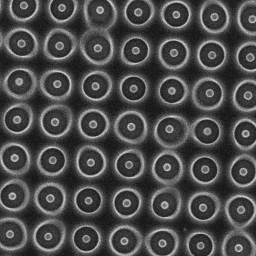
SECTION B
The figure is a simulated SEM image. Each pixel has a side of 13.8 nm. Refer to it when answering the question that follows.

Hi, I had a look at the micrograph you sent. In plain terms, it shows an array of small figures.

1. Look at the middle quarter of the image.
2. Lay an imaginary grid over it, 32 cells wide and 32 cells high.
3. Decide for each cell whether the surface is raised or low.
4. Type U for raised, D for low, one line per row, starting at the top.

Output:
UUUUUUUUUUUUUUUUUUUUUUUUUUDDDUUU
UUUUUUUUUUUUUUUUUUUUUUUUUUUUUUUU
UUUUUUUDDUUUUUUUUUUUUUUUUUUUUUUU
DUUUUUDDDDDUUUUUDDDUUUUUUUUDUUUU
DDUUUDDDDDDUUUUDDDDDUUUUUDDDDUUU
DDUUUDDDDDDDUUDDDDDDUUUUDDDDDDUU
DUUUUDDDDDDUUUDDDDDDDUUUDDDDDDUU
DUUUUDDDDDDUUUUDDDDDUUUUDDDDDDUU
UUUUUUDDDDUUUUUDDDDUUUUUUDDDDDUU
UUUUUUUUUUUUUUUUUUUUUUUUUUDDDUUU
UUUUUUUUUUUUUUUUUUUUUUUUUUUUUUUU
UUUUUUUUUUUUUUUUUUUUUUUUUUUUUUUU
DUUUUDDDDDUUUUUDDDUUUUUUUUUUUUUU
DUUUDDDDDDUUUUDDDDDDUUUUUDDDUUUU
DUUUDDDDDDDUUDDDDDDDUUUUDDDDDDUU
DUUUDDDDDDDUUDDDDDDDUUUDDDDDDDUU
DUUUDDDDDDUUUDDDDDDDUUUDDDDDDDDU
UUUUUDDDDDUUUUDDDDDDUUUDDDDDDDUU
UUUUUUUUUUUUUUUDDDDUUUUDDDDDDDUU
UUUUUUUUUUUUUUUUUUUUUUUUDDDDDUUU
UUUUUUUUUUUUUUUUUUUUUUUUUUUUUUUU
UUUUUDDDUUUUUUUUUUUUUUUUUUUUUUUU
UUUUDDDDDUUUUUUDDDDUUUUUUDDUUUUU
UUUDDDDDDDUUUUDDDDDUUUUDDDDDUUUU
UUUDDDDDDDUUUDDDDDDDUUUDDDDDDUUU
UUUDDDDDDDUUUDDDDDDDUUDDDDDDDUUU
UUUUDDDDDDUUUDDDDDDUUUDDDDDDDUUU
UUUUUDDDDUUUUUDDDDDUUUUDDDDDDUUU
UUUUUUUUUUUUUUUUDUUUUUUDDDDDUUUU
UUUUUUUUUUUUUUUUUUUUUUUUUDUUUUUU
UUUUUUUUUUUUUUUUUUUUUUUUUUUUUUUU
UUUUDDDDUUUUUUUDUUUUUUUUUUDUUUUU